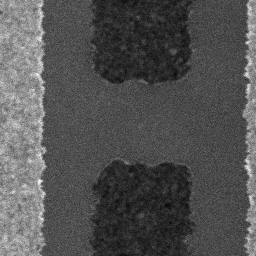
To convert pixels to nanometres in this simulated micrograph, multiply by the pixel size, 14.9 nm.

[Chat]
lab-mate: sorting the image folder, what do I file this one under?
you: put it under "one or a few lines or trenches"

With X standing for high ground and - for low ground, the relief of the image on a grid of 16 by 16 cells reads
XXX---XXXXXX----
XXX---XXXXXX----
XXX---XXXXXX----
XXX---XXXXXX----
XXX---XXXXXX---X
XXX-------------
XXX------------X
XXX------------X
XXX-------------
XXX-------------
XXX----XXXXX---X
XXX---XXXXXX----
XXX---XXXXXX----
XXX---XXXXXX----
XXX---XXXXXX----
XXX---XXXXXX---X